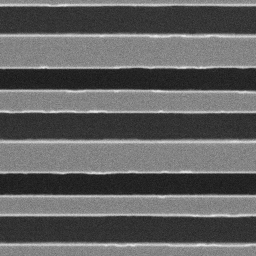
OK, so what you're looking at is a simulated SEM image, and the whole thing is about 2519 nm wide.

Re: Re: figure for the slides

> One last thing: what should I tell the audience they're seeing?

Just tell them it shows lines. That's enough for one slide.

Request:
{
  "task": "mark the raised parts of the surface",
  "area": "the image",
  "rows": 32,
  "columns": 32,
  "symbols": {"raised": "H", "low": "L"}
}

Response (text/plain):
HHHHHHHHHHHHHHHHHHHHHHHHHHHHHHHH
LLLLLLLLLLLLLLLLLLLLLLLLLLLLLLLL
LLLLLLLLLLLLLLLLLLLLLLLLLLLLLLLL
LLLLLLLLLLLLLLLLLLLLLLLLLLLLLLLL
HHHHHHHHHHHHHHHHHHHHHHHHLHHHHLLL
HHHHHHHHHHHHHHHHHHHHHHHHHHHHHHHH
HHHHHHHHHHHHHHHHHHHHHHHHHHHHHHHH
HHHHHHHHHHHHHHHHHHHHHHHHHHHHHHHH
HHHHHHHHHHHHHHHLLLHHHHHHHHHLLLHL
LLLLLLLLLLLLLLLLLLLLLLLLLLLLLLLL
LLLLLLLLLLLLLLLLLLLLLLLLLLLLLLLL
HHHHHHHHHHHHHHHHHHHHHHHHHHHHHHHH
HHHHHHHHHHHHHHHHHHHHHHHHHHHHHHHH
HHHHHHHHHHHHHHHHHHHHHHHHHHHHHHHH
LLLLLLLLLLLLLLLLLLLLLLLLLLLLLLLL
LLLLLLLLLLLLLLLLLLLLLLLLLLLLLLLL
LLLLLLLLLLLLLLLLLLLLLLLLLLLLLLLL
LLLLLLLLLLLLLLLLLLLLLLLLLLLLLLLL
HHHHHHHHHHHHHHHHHHHHHHHHHHHHHHHH
HHHHHHHHHHHHHHHHHHHHHHHHHHHHHHHH
HHHHHHHHHHHHHHHHHHHHHHHHHHHHHHHH
HHHHHHHHHHHHHHHHHHHHHHHHHHHHHHHH
LLLLLLLLLLLLLLLLLLLLLLLLLLLLLLLL
LLLLLLLLLLLLLLLLLLLLLLLLLLLLLLLL
LLLLLLLLLLLLLLLLLLLLLLLLLLLLLLLL
HHHHHHHHHHHHHHHHHHHHHHHHHHHHHHHH
HHHHHHHHHHHHHHHHHHHHHHHHHHHHHHHH
LLLLLLLLLLLLLLLLLLLLLLLLLLLLLLLL
LLLLLLLLLLLLLLLLLLLLLLLLLLLLLLLL
LLLLLLLLLLLLLLLLLLLLLLLLLLLLLLLL
LLLLLLLLLLLLLLLLLLLLLLLLLLLLLLLL
HHHHHHHHHHHHHHHHHHHHHHHHHHHHHHHH